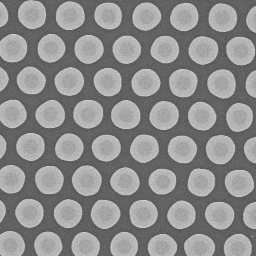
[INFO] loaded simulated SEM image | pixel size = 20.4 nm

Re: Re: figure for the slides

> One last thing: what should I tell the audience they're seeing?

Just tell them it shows an array of small figures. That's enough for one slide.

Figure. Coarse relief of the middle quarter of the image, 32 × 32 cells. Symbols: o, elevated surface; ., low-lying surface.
................................
oooo.....oooo......ooo......ooo.
oooo....oooooo....ooooo....ooooo
ooooo...oooooo...ooooooo..oooooo
ooooo...oooooo...ooooooo..oooooo
ooooo...oooooo...ooooooo..oooooo
oooo....oooooo...ooooooo...ooooo
ooo......oooo.....oooo......oooo
................................
....oooo......ooo.......oo......
...oooooo....ooooo.....ooooo....
...ooooooo..ooooooo...oooooo...o
..oooooooo..ooooooo...ooooooo..o
..oooooooo..ooooooo..ooooooo...o
...oooooo...ooooooo...oooooo...o
....oooo.....ooooo....ooooo.....
................................
oo..............................
oooo....ooooo.....ooooo....oooo.
ooooo..ooooooo...oooooo...oooooo
ooooo..ooooooo...ooooooo..oooooo
ooooo..ooooooo...ooooooo..oooooo
oooo...ooooooo...oooooo...oooooo
oooo....ooooo....ooooo.....ooooo
...................oo.......ooo.
.....o..........................
...ooooo......ooo......ooo......
...oooooo...oooooo....oooooo....
..ooooooo...ooooooo..ooooooo...o
..ooooooo...ooooooo..ooooooo...o
..ooooooo...ooooooo..ooooooo...o
...oooooo....ooooo....ooooo....o